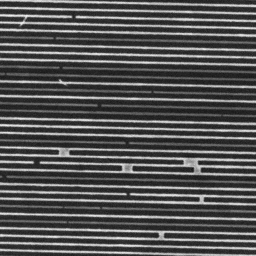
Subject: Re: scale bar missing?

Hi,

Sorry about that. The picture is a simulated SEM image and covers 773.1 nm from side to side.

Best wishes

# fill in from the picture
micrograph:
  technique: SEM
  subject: parallel lines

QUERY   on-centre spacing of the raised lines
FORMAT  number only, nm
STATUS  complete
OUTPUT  22.2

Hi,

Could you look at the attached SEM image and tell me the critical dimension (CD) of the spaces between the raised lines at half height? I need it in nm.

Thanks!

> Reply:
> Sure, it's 17.7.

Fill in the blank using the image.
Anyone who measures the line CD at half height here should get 4.5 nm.